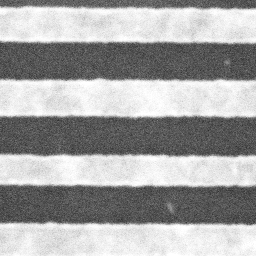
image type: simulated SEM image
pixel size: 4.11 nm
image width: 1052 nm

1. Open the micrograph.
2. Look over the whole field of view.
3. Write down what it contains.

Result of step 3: lines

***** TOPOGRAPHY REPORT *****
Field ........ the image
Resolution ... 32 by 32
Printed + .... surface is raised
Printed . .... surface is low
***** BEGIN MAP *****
................................
++++++++++++++++++++++++++++++++
++++++++++++++++++++++++++++++++
++++++++++++++++++++++++++++++++
++++++++++++++++++++++++++++++++
................................
................................
................................
................................
................................
++++++++++++++++++++++++++++++++
++++++++++++++++++++++++++++++++
++++++++++++++++++++++++++++++++
++++++++++++++++++++++++++++++++
................+...........+..+
................................
................................
................................
................................
++++......+++.+.+++.+...........
++++++++++++++++++++++++++++++++
++++++++++++++++++++++++++++++++
++++++++++++++++++++++++++++++++
................................
................................
................................
................................
................................
++++++++++++++++++++++++++++++++
++++++++++++++++++++++++++++++++
++++++++++++++++++++++++++++++++
++++++++++++++++++++++++++++++++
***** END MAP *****